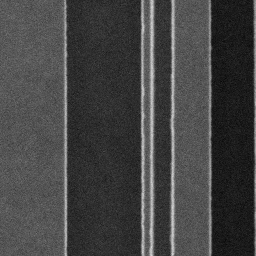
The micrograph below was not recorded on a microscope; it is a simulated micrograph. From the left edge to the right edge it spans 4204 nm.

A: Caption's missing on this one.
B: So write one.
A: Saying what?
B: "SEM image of lines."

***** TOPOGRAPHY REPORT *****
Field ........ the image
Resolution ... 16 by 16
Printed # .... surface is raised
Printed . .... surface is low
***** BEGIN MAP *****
####.....####...
####.....####...
####.....####...
####.....####...
####.....####...
####.....####...
####.....####...
####.....####...
####.....####...
####.....####...
####.....####...
####.....####...
####.....####...
####.....####...
####.....####...
####.....####...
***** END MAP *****